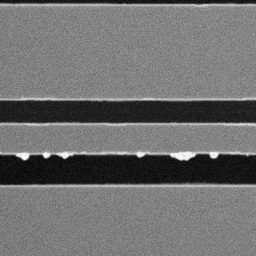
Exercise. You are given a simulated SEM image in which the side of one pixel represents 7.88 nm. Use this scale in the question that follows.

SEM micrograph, lines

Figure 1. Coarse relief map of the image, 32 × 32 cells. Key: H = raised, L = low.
LLLLLLLLLLLLLLLLLLLLLLLLLLLLLLLL
HHHHHHHHHHHHHHHHHHHHHHHHHHHHHHHH
HHHHHHHHHHHHHHHHHHHHHHHHHHHHHHHH
HHHHHHHHHHHHHHHHHHHHHHHHHHHHHHHH
HHHHHHHHHHHHHHHHHHHHHHHHHHHHHHHH
HHHHHHHHHHHHHHHHHHHHHHHHHHHHHHHH
HHHHHHHHHHHHHHHHHHHHHHHHHHHHHHHH
HHHHHHHHHHHHHHHHHHHHHHHHHHHHHHHH
HHHHHHHHHHHHHHHHHHHHHHHHHHHHHHHH
HHHHHHHHHHHHHHHHHHHHHHHHHHHHHHHH
HHHHHHHHHHHHHHHHHHHHHHHHHHHHHHHH
HHHHHHHHHHHHHHHHHHHHHHHHHHHHHHHH
LLLLLLLLLLLLLLLLLLLLLLLLLLLLLLLL
LLLLLLLLLLLLLLLLLLLLLLLLLLLLLLLL
LLLLLLLLLLLLLLLLLLLLLLLLLLLLLLLL
HHHHHHHHHHHHHHHHHHHHHHHHHHHHHHHH
HHHHHHHHHHHHHHHHHHHHHHHHHHHHHHHH
HHHHHHHHHHHHHHHHHHHHHHHHHHHHHHHH
HHHHHHHHHHHHHHHHHHHHHHHHHHHHHHHH
LLHHLHLLHLLLLLLLLHLLLHHHLLHLLLLL
LLLLLLLLLLLLLLLLLLLLLLLLLLLLLLLL
LLLLLLLLLLLLLLLLLLLLLLLLLLLLLLLL
LLLLLLLLLLLLLLLLLLLLLLLLLLLLLLLL
HHHHHHHHHHHHHHHHHHHHHHHHHHHHHHHH
HHHHHHHHHHHHHHHHHHHHHHHHHHHHHHHH
HHHHHHHHHHHHHHHHHHHHHHHHHHHHHHHH
HHHHHHHHHHHHHHHHHHHHHHHHHHHHHHHH
HHHHHHHHHHHHHHHHHHHHHHHHHHHHHHHH
HHHHHHHHHHHHHHHHHHHHHHHHHHHHHHHH
HHHHHHHHHHHHHHHHHHHHHHHHHHHHHHHH
HHHHHHHHHHHHHHHHHHHHHHHHHHHHHHHH
HHHHHHHHHHHHHHHHHHHHHHHHHHHHHHHH